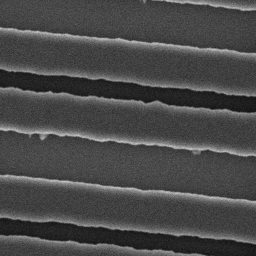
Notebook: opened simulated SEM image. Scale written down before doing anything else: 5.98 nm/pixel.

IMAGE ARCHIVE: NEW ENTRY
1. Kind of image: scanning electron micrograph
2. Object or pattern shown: lines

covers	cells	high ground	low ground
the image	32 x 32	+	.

..........................++++++
................................
................................
+...............................
++++++++++......................
+++++++++++++++++++++...........
++++++++++++++++++++++++++++++..
++++++++++++++++++++++++++++++++
++++++++++++++++++++++++++++++++
.........+++++++++++++++++++++++
.................+++++++++++++++
++++.......................+++++
++++++++++++++++................
+++++++++++++++++++++++++.......
++++++++++++++++++++++++++++++++
++++++++++++++++++++++++++++++++
..++++++++++++++++++++++++++++++
............++++++++++++++++++++
......................++++++++++
..............................+.
................................
................................
++++++..........................
+++++++++++++++.................
++++++++++++++++++++++++++......
++++++++++++++++++++++++++++++++
++++++++++++++++++++++++++++++++
...+++++++++++++++++++++++++++++
.............+++++++++++++++++++
+.......................++++++++
++++++++++......................
++++++++++++++++++++++..........